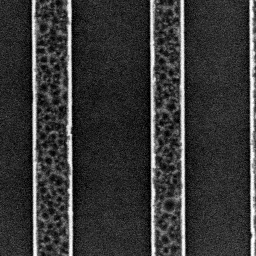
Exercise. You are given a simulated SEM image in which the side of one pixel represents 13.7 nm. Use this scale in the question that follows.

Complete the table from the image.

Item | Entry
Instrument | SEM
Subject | one or a few lines or trenches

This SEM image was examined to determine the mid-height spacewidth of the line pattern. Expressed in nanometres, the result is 1030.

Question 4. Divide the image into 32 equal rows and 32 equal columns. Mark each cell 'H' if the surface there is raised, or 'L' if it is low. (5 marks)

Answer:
LLLLHHHHHLLLLLLLLLLHHHHLLLLLLLLH
LLLLHHHHHLLLLLLLLLLHHHHLLLLLLLLH
LLLLHHHHHLLLLLLLLLLHHHHLLLLLLLLL
LLLLHHHHHLLLLLLLLLLHHHHLLLLLLLLL
LLLLHHHHHLLLLLLLLLLHHHHLLLLLLLLL
LLLLHHHHHLLLLLLLLLLHHHHLLLLLLLLL
LLLLHHHHHLLLLLLLLLLHHHHLLLLLLLLL
LLLLHHHHHLLLLLLLLLLHHHHLLLLLLLLL
LLLLHHHHHLLLLLLLLLLHHHHLLLLLLLLL
LLLLHHHHHLLLLLLLLLLHHHHLLLLLLLLL
LLLLHHHHHLLLLLLLLLLHHHHLLLLLLLLL
LLLLHHHHHLLLLLLLLLLHHHHLLLLLLLLH
LLLLHHHHHLLLLLLLLLLHHHHLLLLLLLLL
LLLLHHHHHLLLLLLLLLLHHHHLLLLLLLLL
LLLLHHHHHLLLLLLLLLLHHHHLLLLLLLLL
LLLLHHHHHLLLLLLLLLLHHHHLLLLLLLLL
LLLLHHHHHLLLLLLLLLLHHHHLLLLLLLLH
LLLLHHHHHLLLLLLLLLLHHHHLLLLLLLLH
LLLLHHHHHLLLLLLLLLLHHHHLLLLLLLLH
LLLLHHHHHLLLLLLLLLLHHHHLLLLLLLLH
LLLLHHHHHLLLLLLLLLLHHHHLLLLLLLLH
LLLLHHHHHLLLLLLLLLLHHHHLLLLLLLLH
LLLLHHHHHLLLLLLLLLLHHHHLLLLLLLLL
LLLLHHHHHLLLLLLLLLLHHHHLLLLLLLLL
LLLLHHHHHLLLLLLLLLLHHHHLLLLLLLLL
LLLLHHHHHLLLLLLLLLLHHHHLLLLLLLLL
LLLLHHHHHLLLLLLLLLLHHHHLLLLLLLLL
LLLLHHHHHLLLLLLLLLLHHHHLLLLLLLLL
LLLLHHHHHLLLLLLLLLLHHHHLLLLLLLLL
LLLLHHHHHLLLLLLLLLLHHHHLLLLLLLLL
LLLLHHHHHLLLLLLLLLLHHHHLLLLLLLLL
LLLLLHHHHLLLLLLLLLLHHHHLLLLLLLLL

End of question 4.